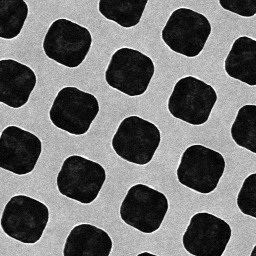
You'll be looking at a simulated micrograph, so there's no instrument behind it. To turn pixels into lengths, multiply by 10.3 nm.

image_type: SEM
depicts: a regular array of holes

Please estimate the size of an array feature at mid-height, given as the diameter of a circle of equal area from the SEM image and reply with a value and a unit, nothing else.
485 nanometres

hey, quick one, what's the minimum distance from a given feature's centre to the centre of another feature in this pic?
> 704 nanometres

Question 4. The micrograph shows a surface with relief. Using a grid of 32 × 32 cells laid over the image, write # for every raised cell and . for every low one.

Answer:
...#########......##########....
...##########.....####...####...
...####.######...####.....######
...###.....#########......######
..####.....#########......######
#####......##########.....###...
######.....###....####...####...
#.#####...####.....#########....
....#########......#########....
....#########......##########...
....##########.....###....#####.
....###....####...####.....#####
...####.....#########......#####
######......#########......###..
######......##########....####..
#######....####....#####.####...
....####...####.....#########...
.....#########......#########...
.....#########......####..#####.
.....####.#####....####.....####
....####....#####.####......####
#...###......#########......####
#######......#########.....####.
#######......###...#####...###..
##.#####....####.....#########..
#....##########......#########..
......#########......#########..
......#########.....####....####
......###...#####...###......###
#....####.....#########......###
########......#########.....####
########......##########....###.